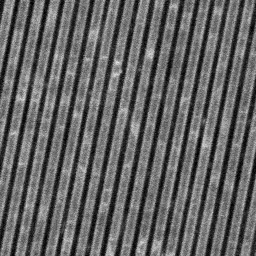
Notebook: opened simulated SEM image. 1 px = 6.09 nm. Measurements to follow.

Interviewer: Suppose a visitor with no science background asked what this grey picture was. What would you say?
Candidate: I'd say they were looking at parallel lines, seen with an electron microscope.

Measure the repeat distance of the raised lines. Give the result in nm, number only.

89.8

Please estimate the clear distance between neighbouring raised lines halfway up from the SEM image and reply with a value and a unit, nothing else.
37.4 nanometres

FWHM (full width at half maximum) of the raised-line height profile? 53.1 nm